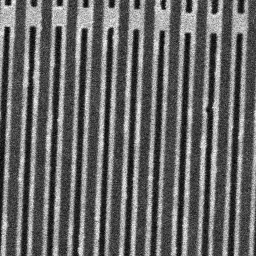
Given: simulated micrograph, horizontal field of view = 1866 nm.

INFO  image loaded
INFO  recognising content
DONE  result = parallel lines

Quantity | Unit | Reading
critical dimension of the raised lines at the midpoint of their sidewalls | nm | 37.3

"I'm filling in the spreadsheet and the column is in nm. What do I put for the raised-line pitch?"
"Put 94.4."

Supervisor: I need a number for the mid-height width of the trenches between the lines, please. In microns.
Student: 0.0691